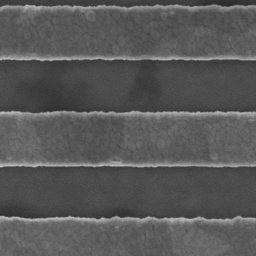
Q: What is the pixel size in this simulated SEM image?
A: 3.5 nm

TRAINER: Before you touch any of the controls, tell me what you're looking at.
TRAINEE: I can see lines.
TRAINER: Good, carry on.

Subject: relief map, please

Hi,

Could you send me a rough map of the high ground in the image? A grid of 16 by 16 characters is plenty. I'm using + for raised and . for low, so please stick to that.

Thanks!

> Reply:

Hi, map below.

++++++++++++++++
++++++++++++++++
++++++++++++++++
++++++++++++++++
................
................
................
++++++++++++++++
++++++++++++++++
++++++++++++++++
................
................
................
................
++++++++++++++++
++++++++++++++++